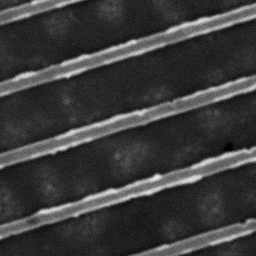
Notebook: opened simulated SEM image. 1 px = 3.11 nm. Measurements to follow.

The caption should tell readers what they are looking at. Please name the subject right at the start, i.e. one or a few lines or trenches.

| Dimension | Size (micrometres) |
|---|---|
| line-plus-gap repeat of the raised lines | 0.212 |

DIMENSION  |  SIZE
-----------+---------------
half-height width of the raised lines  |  44.6 nm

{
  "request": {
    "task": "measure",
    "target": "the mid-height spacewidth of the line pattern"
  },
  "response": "168 nm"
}